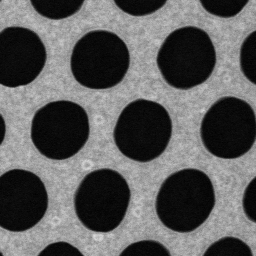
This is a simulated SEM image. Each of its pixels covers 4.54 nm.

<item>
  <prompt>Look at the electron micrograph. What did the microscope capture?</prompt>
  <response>holes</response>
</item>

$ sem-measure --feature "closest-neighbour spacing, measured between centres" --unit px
80.6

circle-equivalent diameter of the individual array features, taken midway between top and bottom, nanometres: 272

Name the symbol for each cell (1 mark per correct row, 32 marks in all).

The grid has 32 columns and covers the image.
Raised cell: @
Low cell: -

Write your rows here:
@@@@------@@@@-------@@@@------@
@@@@@-----@@@@@----@@@@@@@----@@
@@@@@@@@@@@@@@@@@@@@@@@@@@@@@@@@
@--@@@@@@@@@@@@@@@@@@@@--@@@@@@@
-----@@@@@-----@@@@@@-----@@@@@-
-----@@@@-------@@@@-------@@@--
------@@@-------@@@@-------@@@--
------@@@-------@@@--------@@@--
-----@@@@-------@@@@-------@@@--
-----@@@@-------@@@@------@@@@@-
---@@@@@@@-----@@@@@@----@@@@@@@
@@@@@@@@@@@@@@@@@@@@@@@@@@@@@@@@
@@@@@@@@@@@@@@@@@-@@@@@@@@@---@@
@@@@@-----@@@@@@-----@@@@@-----@
@@@@-------@@@@------@@@@@------
-@@@-------@@@@------@@@@-------
-@@@-------@@@-------@@@@-------
@@@@-------@@@-------@@@@-------
@@@@@-----@@@@@------@@@@@-----@
@@@@@@---@@@@@@@----@@@@@@@---@@
@@@@@@@@@@@@@@@@@@@@@@@@@@@@@@@@
@---@@@@@@@----@@@@@@@---@@@@@@@
-----@@@@@------@@@@@-----@@@@@@
------@@@@------@@@@-------@@@@-
------@@@-------@@@@-------@@@--
------@@@-------@@@--------@@@--
------@@@-------@@@@------@@@@@-
-----@@@@@-----@@@@@------@@@@@-
----@@@@@@@---@@@@@@@----@@@@@@@
@@@@@@@@@@@@@@@@@@@@@@@@@@@@@@@@
@@@@@@---@@@@@@@----@@@@@@-----@
@@@@@-----@@@@@------@@@@@-----@